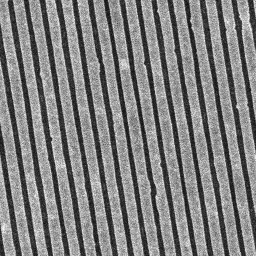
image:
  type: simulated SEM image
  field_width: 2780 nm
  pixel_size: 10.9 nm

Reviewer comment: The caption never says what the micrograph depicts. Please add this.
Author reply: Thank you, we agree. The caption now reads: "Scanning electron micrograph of parallel lines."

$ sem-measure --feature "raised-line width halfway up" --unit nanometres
108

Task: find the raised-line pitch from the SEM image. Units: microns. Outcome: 0.171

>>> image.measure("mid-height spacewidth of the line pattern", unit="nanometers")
63